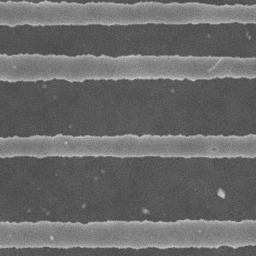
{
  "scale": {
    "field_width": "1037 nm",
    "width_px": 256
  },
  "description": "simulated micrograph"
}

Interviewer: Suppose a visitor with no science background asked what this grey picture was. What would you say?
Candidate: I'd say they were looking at lines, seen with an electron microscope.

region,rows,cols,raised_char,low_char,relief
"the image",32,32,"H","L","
HHHHHHHHHHHHHHHHHHHHHHHHHHLLLLLL
HHHHHHHHHHHHHHHHHHHHHHHHHHHHHHHH
HHHHHHHHHHHHHHHHHHHHHHHHHHHHHHHH
LLLLLLLLLLLLLLLLLLLLLLLLLLLLLLLL
LLLLLLLLLLLLLLLLLLLLLLLLLLLLLLLL
LLLLLLLLLLLLLLLLLLLLLLLLLLLLLLLL
LLLLLLLLLLLLLLLLLLLLLLLLLLLLLLLL
HHHHHHHHHHHHHHHHHHHHHHHHHHHHHHHH
HHHHHHHHHHHHHHHHHHHHHHHHHHHHHHHH
HHHHHHHHHHHHHHHHHHHHHHHHHHHHHHHH
LLLLLLLLLLLLLLLLLLLLLLLLLLLLLLLL
LLLLLLLLLLLLLLLLLLLLLLLLLLLLLLLL
LLLLLLLLLLLLLLLLLLLLLLLLLLLLLLLL
LLLLLLLLLLLLLLLLLLLLLLLLLLLLLLLL
LLLLLLLLLLLLLLLLLLLLLLLLLLLLLLLL
LLLLLLLLLLLLLLLLLLLLLLLLLLLLLLLL
LLLLLLLLLLLLLLLLLLLLLLLLLLLLLLLL
HHHHHHHHHHHHHHHHHHHHHHHHHHHHHHHH
HHHHHHHHHHHHHHHHHHHHHHHHHHHHHHHH
HHLHHHHHHHHHHHHHHHLLHHHHHHHHHHHH
LLLLLLLLLLLLLLLLLLLLLLLLLLLLLLLL
LLLLLLLLLLLLLLLLLLLLLLLLLLLLLLLL
LLLLLLLLLLLLLLLLLLLLLLLLLLLLLLLL
LLLLLLLLLLLLLLLLLLLLLLLLLLLLLLLL
LLLLLLLLLLLLLLLLLLLLLLLLLLLLLLLL
LLLLLLLLLLLLLLLLLLLLLLLLLLLLLLLL
LLLLLLLLLLLLLLLLLLLLLLLLLLLLLLLL
LLLLLLLLLLLLLLLLLLLLLLLHLHLLLLLL
HHHHHHHHHHHHHHHHHHHHHHHHHHHHHHHH
HHHHHHHHHHHHHHHHHHHHHHHHHHHHHHHH
HHHHHHHHHHHHHHHHHHHHHHHHHHHHHHHH
LLLLLLLLLLLLLLLLLLLLLLLLLLLLLLLL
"